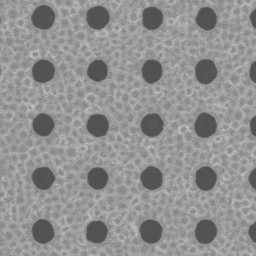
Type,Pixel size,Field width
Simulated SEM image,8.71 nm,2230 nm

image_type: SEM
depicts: a regular array of holes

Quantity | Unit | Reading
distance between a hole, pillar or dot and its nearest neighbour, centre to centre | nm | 463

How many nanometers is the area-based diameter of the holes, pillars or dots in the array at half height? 202